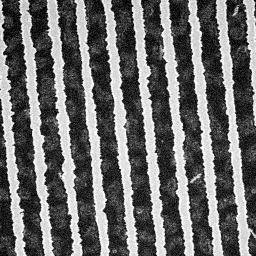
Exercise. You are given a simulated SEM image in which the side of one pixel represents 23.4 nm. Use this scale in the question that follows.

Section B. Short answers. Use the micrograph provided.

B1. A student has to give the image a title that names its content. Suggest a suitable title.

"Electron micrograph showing parallel lines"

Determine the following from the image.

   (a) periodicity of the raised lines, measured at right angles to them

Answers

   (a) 0.653 um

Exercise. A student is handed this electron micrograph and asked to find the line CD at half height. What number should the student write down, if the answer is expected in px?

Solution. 8.46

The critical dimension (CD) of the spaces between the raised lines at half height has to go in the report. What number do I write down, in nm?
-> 453